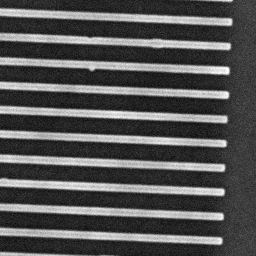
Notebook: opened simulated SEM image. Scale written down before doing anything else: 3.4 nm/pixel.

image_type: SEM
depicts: parallel lines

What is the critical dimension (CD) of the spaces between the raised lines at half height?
17.7 pixels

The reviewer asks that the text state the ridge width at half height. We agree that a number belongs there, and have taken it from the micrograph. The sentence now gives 22.1 nanometres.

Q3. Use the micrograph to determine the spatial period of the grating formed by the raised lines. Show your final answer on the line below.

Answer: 24.3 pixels